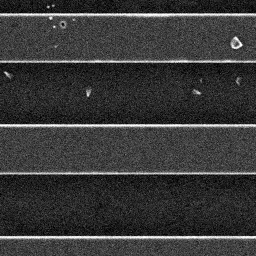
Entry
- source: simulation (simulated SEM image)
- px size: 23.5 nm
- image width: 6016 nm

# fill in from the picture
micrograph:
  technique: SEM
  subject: lines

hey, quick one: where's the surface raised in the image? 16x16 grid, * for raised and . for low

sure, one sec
................
****************
****************
****************
................
................
................
................
****************
****************
****************
................
................
................
................
****************